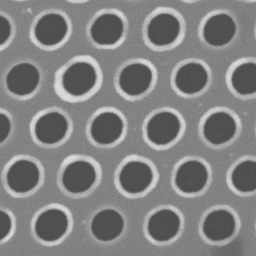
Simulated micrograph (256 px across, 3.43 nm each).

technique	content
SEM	a regular array of holes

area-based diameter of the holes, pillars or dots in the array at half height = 0.109 µm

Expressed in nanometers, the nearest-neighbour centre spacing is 190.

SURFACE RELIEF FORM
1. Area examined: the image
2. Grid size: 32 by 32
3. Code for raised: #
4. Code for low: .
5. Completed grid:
################################
################################
.####...####...####...####...###
.###....###....####...###....###
.####...###....####...###....###
#####..#####..#####..#####..####
################################
################################
##..#####...####...####..#####..
#....###....###....###....###...
#....###....###....###....###...
##..#####..#####..#####..#####..
################################
################################
.####...####...####...####...###
.####...###....####...####...###
.###....###....###....####...###
#####...####..#####...####...###
################################
################################
##..#####..#####..#####..#####..
#....###....###....###....###...
#....###....###....###....###...
#...####...####...####...#####..
################################
################################
#####...#####..#####..#####..###
.####...####...####...####...###
.###....###....###....###....###
.####...####...####...####...###
################################
################################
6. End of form